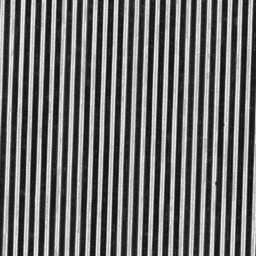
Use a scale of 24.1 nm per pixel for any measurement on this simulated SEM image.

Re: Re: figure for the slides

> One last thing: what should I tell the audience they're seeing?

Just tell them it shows parallel lines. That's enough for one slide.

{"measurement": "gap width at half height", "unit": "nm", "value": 142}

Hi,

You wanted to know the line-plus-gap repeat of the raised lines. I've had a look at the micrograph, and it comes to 250 nm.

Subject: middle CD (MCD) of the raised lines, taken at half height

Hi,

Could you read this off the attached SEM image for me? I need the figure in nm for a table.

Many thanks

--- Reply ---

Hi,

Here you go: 103